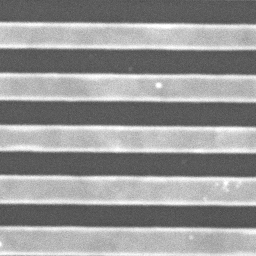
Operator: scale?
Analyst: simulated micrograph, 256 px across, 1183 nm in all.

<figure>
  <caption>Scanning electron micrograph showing wiring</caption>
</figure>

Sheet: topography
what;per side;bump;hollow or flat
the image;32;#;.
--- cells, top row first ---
................................
................................
................................
################################
################################
################################
................................
................................
................................
################################
################################
################################
........########################
................................
................................
................................
################################
################################
################################
................................
................................
................................
################################
################################
################################
.................###############
................................
................................
####################............
################################
################################
################################